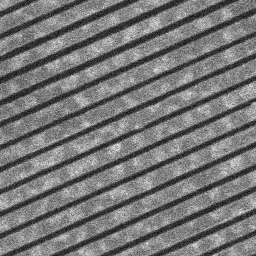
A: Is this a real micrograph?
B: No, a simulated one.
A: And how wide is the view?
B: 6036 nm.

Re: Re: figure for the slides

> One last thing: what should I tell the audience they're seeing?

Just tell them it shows parallel lines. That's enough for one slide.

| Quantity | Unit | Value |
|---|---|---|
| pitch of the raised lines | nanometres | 477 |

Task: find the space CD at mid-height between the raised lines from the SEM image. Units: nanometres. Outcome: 153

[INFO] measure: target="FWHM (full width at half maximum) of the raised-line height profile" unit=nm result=320